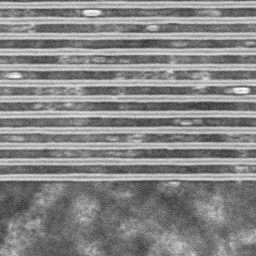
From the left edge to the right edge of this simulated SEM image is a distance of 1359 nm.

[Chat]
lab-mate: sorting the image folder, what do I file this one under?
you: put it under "parallel lines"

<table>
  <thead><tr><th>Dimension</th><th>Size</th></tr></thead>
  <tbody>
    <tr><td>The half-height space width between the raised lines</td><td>57.7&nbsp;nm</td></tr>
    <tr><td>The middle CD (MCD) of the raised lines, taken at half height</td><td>0.0272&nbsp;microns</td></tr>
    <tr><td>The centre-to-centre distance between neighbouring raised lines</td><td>83.1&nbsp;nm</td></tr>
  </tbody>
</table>